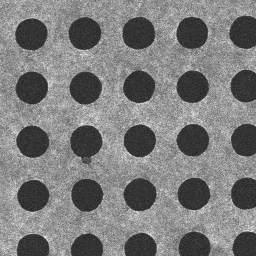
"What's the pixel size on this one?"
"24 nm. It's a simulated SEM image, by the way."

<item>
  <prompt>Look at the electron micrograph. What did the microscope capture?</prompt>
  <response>a regular array of holes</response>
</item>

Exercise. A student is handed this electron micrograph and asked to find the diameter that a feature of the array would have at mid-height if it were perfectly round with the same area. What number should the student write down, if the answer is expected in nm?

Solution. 781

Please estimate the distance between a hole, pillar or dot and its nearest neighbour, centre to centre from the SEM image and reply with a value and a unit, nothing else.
1280 nanometres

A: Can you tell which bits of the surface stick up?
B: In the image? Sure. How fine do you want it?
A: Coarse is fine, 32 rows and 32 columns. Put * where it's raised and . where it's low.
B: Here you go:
********************************
********************************
***..****...****...****..****...
**....***....**....***....***...
**....***....**....***....***...
**....***...****...****..****...
********************************
********************************
********************************
***..****...****...****...***...
**....***....**....***....***...
**....***....**....***....***...
***..****...****...****..*****..
********************************
********************************
********************************
***...***...****...***....***...
**....***....**.....**....***...
**....***....***...***....***...
***..*****..*****.************.*
********************************
********************************
**********..*****.*****..*****..
**....***....***...***....***...
**....***....**....***....***...
**....***....***...****...***...
********************************
********************************
********************************
***..*****..****...****...****..
**....***....***....**....***...
**....***....***....**....***...